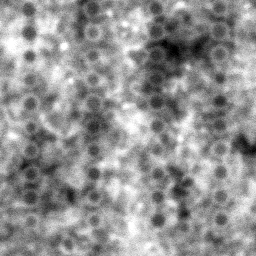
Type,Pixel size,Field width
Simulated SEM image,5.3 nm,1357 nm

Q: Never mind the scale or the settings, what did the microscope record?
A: a regular array of raised bodies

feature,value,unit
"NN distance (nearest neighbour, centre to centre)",23.4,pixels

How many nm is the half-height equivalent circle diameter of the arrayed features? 84